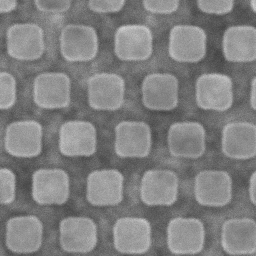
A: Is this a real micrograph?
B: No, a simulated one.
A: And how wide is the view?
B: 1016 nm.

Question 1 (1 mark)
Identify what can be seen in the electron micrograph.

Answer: a regular array of raised bodies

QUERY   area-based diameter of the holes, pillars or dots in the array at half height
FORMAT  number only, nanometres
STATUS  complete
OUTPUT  148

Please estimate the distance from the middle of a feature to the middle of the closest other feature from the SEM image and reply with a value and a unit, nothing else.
214 nm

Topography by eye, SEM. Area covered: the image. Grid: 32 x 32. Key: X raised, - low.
XX--XXXXX--XXXX---XXXX---XXXX---
-------------------XX-----XX----
--------------------------------
-XXXX---XXX----XXX----XXX----XXX
-XXXX---XXXX---XXXX--XXXXX--XXXX
-XXXX---XXXX---XXXX--XXXXX--XXXX
-XXXX---XXXX--XXXXX--XXXXX--XXXX
---------X------------XXX----XXX
--------------------------------
X----XXX----XXX----XX----XXX----
XX--XXXXX--XXXX---XXXX---XXXX---
XX--XXXXX--XXXX---XXXX---XXXX---
XX--XXXXX--XXXX---XXXX---XXXX--X
X-----------XXX----XX----XXX----
--------------------------------
--XXX---XXX----XXX----XXX-------
-XXXX---XXXX---XXXX--XXXX---XXXX
-XXXX---XXXX---XXXX--XXXX---XXXX
-XXXX---XXXX---XXXX--XXXX---XXXX
---------------X-X----XXX----XX-
--------------------------------
X----XXX----XXX----XX-----------
XX--XXXX---XXXX---XXXX---XXXX--X
XX--XXXX---XXXX---XXXX--XXXXX--X
XX--XXXX---XXXX---XXXX---XXXX--X
------------XX----XXX----XXX----
--------------------------------
-XXXX---XXX----XXX----XX------X-
-XXXX---XXXX--XXXXX--XXXX---XXXX
-XXXX---XXXX--XXXXX--XXXX---XXXX
-XXXX---XXXX--XXXXX--XXXX---XXXX
--XX-----------XXX----XXX----XXX